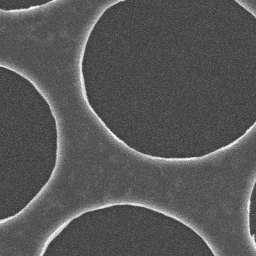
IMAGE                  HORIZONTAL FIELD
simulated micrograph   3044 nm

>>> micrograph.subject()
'holes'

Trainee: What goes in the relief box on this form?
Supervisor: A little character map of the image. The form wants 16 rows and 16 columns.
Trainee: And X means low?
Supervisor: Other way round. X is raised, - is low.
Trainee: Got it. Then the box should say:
--XXXXX--------X
XXXXXX----------
XXXXX-----------
XXXXX-----------
-XXXX-----------
--XXX-----------
---XXX----------
---XXX----------
----XXX--------X
----XXXXX----XXX
---XXXXXXXXXXXXX
---XXXXXXXXXXXXX
--XXXXXXXXXXXXXX
-XXXX------XXXXX
XXXX--------XXXX
XXX----------XXX